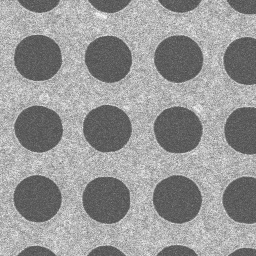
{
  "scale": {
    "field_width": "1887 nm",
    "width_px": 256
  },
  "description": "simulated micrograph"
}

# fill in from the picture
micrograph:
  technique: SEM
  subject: a regular array of holes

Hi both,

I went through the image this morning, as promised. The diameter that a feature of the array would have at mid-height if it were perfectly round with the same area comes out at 48.2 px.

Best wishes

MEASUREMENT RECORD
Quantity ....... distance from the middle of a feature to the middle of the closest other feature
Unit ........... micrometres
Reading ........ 0.512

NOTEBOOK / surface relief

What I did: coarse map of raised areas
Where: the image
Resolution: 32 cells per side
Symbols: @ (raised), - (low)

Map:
@@@----@@@@-----@@@@-----@@@@---
@@@@--@@@@@@@--@@@@@@@-@@@@@@@--
@@@@@@@@@@@@@@@@@@@@@@@@@@@@@@@@
@@@@@@@@@@@@@@@@@@@@@@@@@@@@@@@@
@@@@--@@@@@@@-@@@@@@@--@@@@@@@@@
@@-----@@@@-----@@@@-----@@@@---
@@------@@@-----@@@------@@@----
@@------@@@------@@------@@@----
@@------@@@-----@@@@-----@@@----
@@@----@@@@@----@@@@----@@@@@---
@@@@@@@@@@@@@@@@@@@@@@@@@@@@@@--
@@@@@@@@@@@@@@@@@@@@@@@@@@@@@@@@
@@@@@@@@@@@@@@@@@@@@@@@@@@@@@@@@
@@@---@@@@@@---@@@@@@--@@@@@@@--
@@-----@@@@-----@@@@-----@@@@---
@@------@@------@@@------@@@----
@@------@@------@@@------@@@----
@@------@@@-----@@@@-----@@@----
@@@----@@@@@---@@@@@----@@@@@---
@@@@@@@@@@@@@@@@@@@@@@@@@@@@@@@@
@@@@@@@@@@@@@@@@@@@@@@@@@@@@@@@@
@@@@@@@@@@@@@@@@@@@@@@@@@@@@@@@@
@@@---@@@@@@---@@@@@----@@@@@---
@@-----@@@@-----@@@------@@@----
@@------@@------@@@------@@@----
@@------@@------@@@------@@@----
@@-----@@@@-----@@@@-----@@@----
@@@---@@@@@@---@@@@@@---@@@@@---
@@@@@@@@@@@@@@@@@@@@@@@@@@@@@@@@
@@@@@@@@@@@@@@@@@@@@@@@@@@@@@@@@
@@@@@@@@@@@@@@@@@@@@@@@@@@@@@@@@
@@@----@@@@----@@@@@----@@@@@---